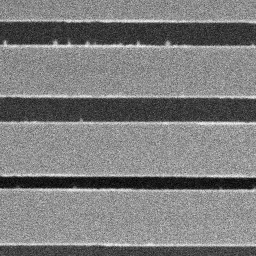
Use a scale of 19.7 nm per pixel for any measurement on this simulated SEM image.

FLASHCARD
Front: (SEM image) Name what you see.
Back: lines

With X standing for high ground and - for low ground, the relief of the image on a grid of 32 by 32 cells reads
XXXXXXXXXXXXXXXXXXXXXXXXXXXXXXXX
XXXXXXXXXXXXXXXXXXXXXXXXXXXXXXXX
XXXXXXXXXXXXXXXXXXXXXXXXXXXXXXXX
--------------------------------
--------------------------------
--------------------------------
XXXXXXXXXXXXXXXXXXXXXXXXXXXXXXXX
XXXXXXXXXXXXXXXXXXXXXXXXXXXXXXXX
XXXXXXXXXXXXXXXXXXXXXXXXXXXXXXXX
XXXXXXXXXXXXXXXXXXXXXXXXXXXXXXXX
XXXXXXXXXXXXXXXXXXXXXXXXXXXXXXXX
XXXXXXXXXXXXXXXXXXXXXXXXXXXXXXXX
--------------------------------
--------------------------------
--------------------------------
XXXXXXXXXXXXXXXXXXXXXXXXXXXXXXXX
XXXXXXXXXXXXXXXXXXXXXXXXXXXXXXXX
XXXXXXXXXXXXXXXXXXXXXXXXXXXXXXXX
XXXXXXXXXXXXXXXXXXXXXXXXXXXXXXXX
XXXXXXXXXXXXXXXXXXXXXXXXXXXXXXXX
XXXXXXXXXXXXXXXXXXXXXXXXXXXXXXXX
XXXXXXXXXXXXXXXXXXXXXXXXXXXXXXXX
--------------------------------
--------------------------------
XXXXXXXXXXXXXXXXXXXXXXXXXXXXXXXX
XXXXXXXXXXXXXXXXXXXXXXXXXXXXXXXX
XXXXXXXXXXXXXXXXXXXXXXXXXXXXXXXX
XXXXXXXXXXXXXXXXXXXXXXXXXXXXXXXX
XXXXXXXXXXXXXXXXXXXXXXXXXXXXXXXX
XXXXXXXXXXXXXXXXXXXXXXXXXXXXXXXX
XXXXXXXXXXXXXXXXXXXXXXXXXXXXXXXX
--------------------------------